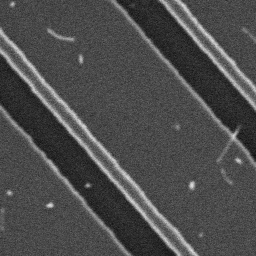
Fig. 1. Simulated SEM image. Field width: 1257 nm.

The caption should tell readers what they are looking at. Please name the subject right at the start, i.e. lines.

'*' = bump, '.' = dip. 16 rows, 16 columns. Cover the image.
********..******
********...*****
*********...****
**********...***
.**********...**
..**********...*
...**********...
*...**********..
**...**********.
***..**********.
****..**********
****...*********
*****...********
******...*******
*******...******
********...*****